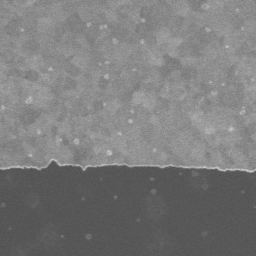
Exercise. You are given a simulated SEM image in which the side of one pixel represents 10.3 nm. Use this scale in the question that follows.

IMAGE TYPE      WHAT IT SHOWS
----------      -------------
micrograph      one or a few lines or trenches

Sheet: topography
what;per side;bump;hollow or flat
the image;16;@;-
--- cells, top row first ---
@@@@@@@@@@@@@@@@
@@@@@@@@@@@@@@@@
@@@@@@@@@@@@@@@@
@@@@@@@@@@@@@@@@
@@@@@@@@@@@@@@@@
@@@@@@@@@@@@@@@@
@@@@@@@@@@@@@@@@
@@@@@@@@@@@@@@@@
@@@@@@@@@@@@@@@@
@@@@@@@@@@@@@@@@
@------------@@@
----------------
----------------
----------------
----------------
----------------